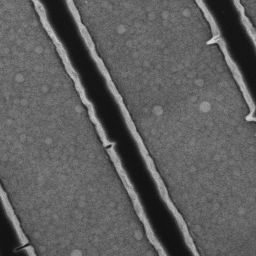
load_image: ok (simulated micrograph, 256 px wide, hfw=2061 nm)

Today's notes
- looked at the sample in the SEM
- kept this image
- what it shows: one or a few lines or trenches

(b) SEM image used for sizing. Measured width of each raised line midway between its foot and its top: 245 nm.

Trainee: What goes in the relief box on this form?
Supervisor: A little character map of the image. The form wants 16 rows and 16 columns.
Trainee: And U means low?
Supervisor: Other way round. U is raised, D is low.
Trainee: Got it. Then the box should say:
DDUUUDDDDDDDDUUD
DDDUUDDDDDDDDUUD
DDDUUUDDDDDDDDUU
DDDDUUDDDDDDDDUU
DDDDUUUDDDDDDDDU
DDDDDUUDDDDDDDDU
DDDDDUUUDDDDDDDD
DDDDDDUUDDDDDDDD
DDDDDDUUUDDDDDDD
DDDDDDDUUDDDDDDD
DDDDDDDUUDDDDDDD
DDDDDDDDUUDDDDDD
DDDDDDDDUUDDDDDD
UDDDDDDDDUUDDDDD
UDDDDDDDDUUUDDDD
UUDDDDDDDDUUDDDD